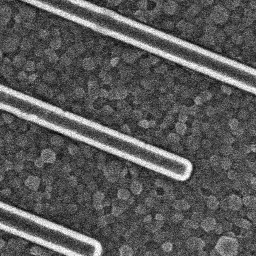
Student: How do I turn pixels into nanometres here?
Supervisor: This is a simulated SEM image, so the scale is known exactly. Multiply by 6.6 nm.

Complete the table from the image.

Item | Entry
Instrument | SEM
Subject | one or a few lines or trenches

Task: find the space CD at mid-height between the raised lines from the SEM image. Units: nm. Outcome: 605